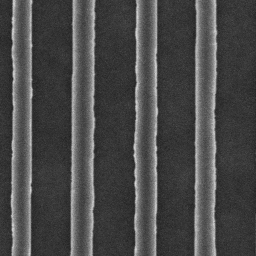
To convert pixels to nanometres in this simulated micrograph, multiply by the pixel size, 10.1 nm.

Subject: lines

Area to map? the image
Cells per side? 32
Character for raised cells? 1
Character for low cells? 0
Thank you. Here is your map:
00110000011100000111000001100000
00110000011100000111000001100000
00110000011100000111000001100000
00110000011100000111000001100000
00110000011100000111000001100000
00110000011100000111000001100000
00110000011100000111000001100000
00110000011100000111000001100000
00110000011100000111000001100000
00110000011100000111000001100000
00110000011100000111000001100000
00110000011100000111000001100000
00110000011100000111000001100000
00110000011100000111000001100000
00110000011100000111000001100000
00110000011100000111000001100000
00110000011100000111000001100000
00110000011100000110000001100000
00110000011100000111000001100000
00110000011100000111000001100000
00110000011100000111000001100000
00110000011100000111000001100000
00110000011100000111000001100000
00110000011100000111000001100000
01110000011100000111000001100000
01110000011100000111000001100000
00110000011000000111000001100000
00110000011100000110000011100000
00110000011000000110000011100000
00110000011000000110000001100000
00110000011000000110000001100000
00110000011000000110000011100000